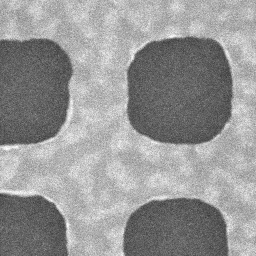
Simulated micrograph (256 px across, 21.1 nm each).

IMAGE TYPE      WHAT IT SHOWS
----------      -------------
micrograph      holes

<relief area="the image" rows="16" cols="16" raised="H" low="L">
HHHHHHHHHHHHHHHH
HHHHHHHHHHHHHHHH
LLLHHHHHHHLLLHHH
LLLLHHHHLLLLLLHH
LLLLLHHHLLLLLLLH
LLLLHHHHLLLLLLLH
LLLLHHHHLLLLLLLH
LLLLHHHHLLLLLLHH
LLLLHHHHHLLLLLHH
HHHHHHHHHHHHHHHH
HHHHHHHHHHHHHHHH
HHHHHHHHHHHHHHHH
LLLHHHHHHHLLLHHH
LLLLHHHHLLLLLLHH
LLLLHHHHLLLLLLHH
LLLLHHHHLLLLLLHH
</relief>